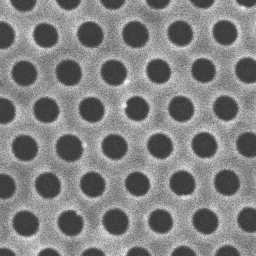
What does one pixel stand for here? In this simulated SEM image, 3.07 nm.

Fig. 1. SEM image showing a regular array of holes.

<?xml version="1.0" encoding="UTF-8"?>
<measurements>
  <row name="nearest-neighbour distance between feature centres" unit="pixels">43.3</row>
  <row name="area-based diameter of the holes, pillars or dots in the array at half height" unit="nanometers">76.3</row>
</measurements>